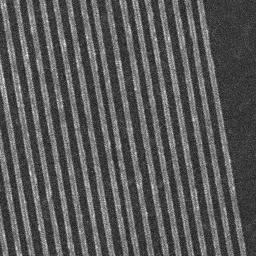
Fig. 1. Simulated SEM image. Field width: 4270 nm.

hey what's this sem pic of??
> parallel lines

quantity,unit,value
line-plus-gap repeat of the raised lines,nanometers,217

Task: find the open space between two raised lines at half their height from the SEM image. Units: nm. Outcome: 138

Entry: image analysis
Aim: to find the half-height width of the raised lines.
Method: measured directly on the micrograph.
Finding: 80.1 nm